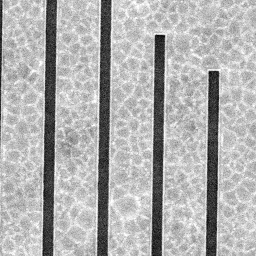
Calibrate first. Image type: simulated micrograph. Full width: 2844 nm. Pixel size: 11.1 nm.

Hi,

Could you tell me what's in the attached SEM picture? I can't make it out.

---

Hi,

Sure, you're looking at parallel lines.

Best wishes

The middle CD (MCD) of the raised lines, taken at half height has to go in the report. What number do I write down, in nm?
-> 476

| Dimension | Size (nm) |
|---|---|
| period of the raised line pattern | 604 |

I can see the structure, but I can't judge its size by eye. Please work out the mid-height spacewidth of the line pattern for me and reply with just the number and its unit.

126 nanometers